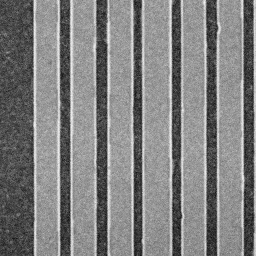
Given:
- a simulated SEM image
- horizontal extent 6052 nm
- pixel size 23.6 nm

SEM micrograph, parallel lines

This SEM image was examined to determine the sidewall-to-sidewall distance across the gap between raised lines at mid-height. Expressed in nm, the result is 298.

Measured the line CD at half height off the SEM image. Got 573 nanometers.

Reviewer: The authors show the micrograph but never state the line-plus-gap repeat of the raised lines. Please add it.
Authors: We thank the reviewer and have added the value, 867 nm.